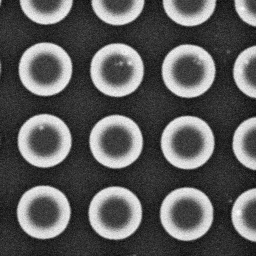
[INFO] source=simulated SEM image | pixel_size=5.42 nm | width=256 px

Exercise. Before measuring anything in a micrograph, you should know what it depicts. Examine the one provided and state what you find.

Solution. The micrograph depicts an array of small figures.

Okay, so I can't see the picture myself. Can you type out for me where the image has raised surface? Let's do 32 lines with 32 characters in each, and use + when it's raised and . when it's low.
...++++++...++++++..+++++++..+++
...++++++...++++++...++++++...++
....++++.....++++.....++++....++
................................
................................
.....+..........................
...+++++....+++++....+++++....++
...++++++...++++++...++++++...++
..+++++++..+++++++..+++++++..+++
..+++++++..+++++++..+++++++..+++
...+++++....+++++....+++++....++
....+++......+++......++++....++
................................
................................
.....++.......+.................
...+++++....+++++....+++++....++
..+++++++..+++++++..++++++...+++
..+++++++..+++++++..+++++++..+++
..+++++++..+++++++..+++++++..+++
...+++++....+++++....+++++....++
....+++......+++......+++.....++
................................
................................
....+++.......+.................
...+++++....+++++....+++++....++
..+++++++..++++++...++++++...+++
..+++++++..+++++++..+++++++..+++
..+++++++..+++++++..+++++++..+++
...+++++....+++++....+++++...+++
....+++......+++......+++.....++
................................
................................